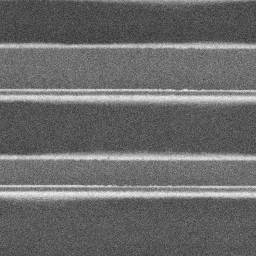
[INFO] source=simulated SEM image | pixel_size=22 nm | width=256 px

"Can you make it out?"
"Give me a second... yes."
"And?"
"lines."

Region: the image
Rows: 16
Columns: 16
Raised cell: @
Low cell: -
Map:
----------------
----------------
----------------
@@@@@@@@@@@@@@@@
@@@@@@@@@@@@@@@@
@@@@@@@@@@@@@@@@
----------------
----------------
----------------
----------------
@@@@@@@@@@@@@@@@
@@@@@@@@@@@@@@@@
----------------
----------------
----------------
----------------